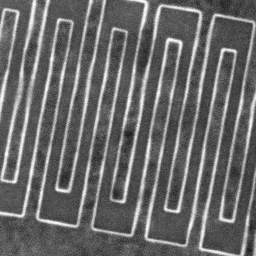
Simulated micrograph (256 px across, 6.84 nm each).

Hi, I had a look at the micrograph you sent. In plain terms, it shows groups of lines, slits or small figures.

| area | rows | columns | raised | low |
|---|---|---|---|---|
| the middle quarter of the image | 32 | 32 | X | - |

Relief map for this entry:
----XXX----XXX----XXX----XXX----
----XXX----XXX----XXX----XXX----
---XXXX----XXX---XXXX---XXXX---X
---XXX----XXXX---XXXX---XXXX---X
---XXX----XXX----XXX----XXXX---X
---XXX----XXX----XXX----XXXX---X
---XXX----XXX----XXX----XXX----X
--XXXX---XXXX----XXX---XXXX----X
--XXXX---XXXX---XXXX---XXXX---XX
--XXXX---XXXX---XXXX---XXXX---XX
--XXX----XXX----XXX----XXXX---XX
-XXXX----XXX----XXX----XXX----XX
-XXXX----XXX----XXX---XXXX---XXX
-XXXX---XXXX---XXXX---XXXX---XXX
-XXXX---XXXX---XXXX---XXXX---XXX
-XXXX---XXXX---XXXX---XXXX---XXX
XXXX----XXX----XXX----XXX----XXX
XXXX----XXX----XXX---XXXX----XXX
XXXX---XXXX---XXXX---XXXX----XXX
XXXX---XXXX---XXXX---XXXX---XXXX
XXXX---XXXX---XXXX---XXXX---XXXX
XXX----XXX----XXX----XXX----XXXX
XXX----XXX----XXX----XXX----XXX-
XXX---XXXX---XXXX----XXX---XXXX-
XXX---XXXX---XXXX----XXX---XXXX-
XXX---XXXX---XXXX----XXX---XXXX-
XX----XXXX---XXX----XXXX---XXXX-
XX----XXX----XXX----XXX----XXXX-
XX----XXX---XXXX----XXX----XXX--
XX----XXX---XXXX----XXX---XXXX--
XX---XXXX---XXXX----XXX---XXXX--
X----XXXX---XXX-----XXX---XXXX--